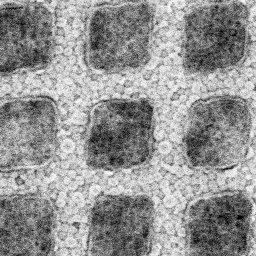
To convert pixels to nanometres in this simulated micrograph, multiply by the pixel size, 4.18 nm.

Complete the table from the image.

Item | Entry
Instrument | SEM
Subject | raised bodies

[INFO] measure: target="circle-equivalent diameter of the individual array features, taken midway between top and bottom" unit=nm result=259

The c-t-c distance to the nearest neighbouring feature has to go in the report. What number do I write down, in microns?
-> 0.404